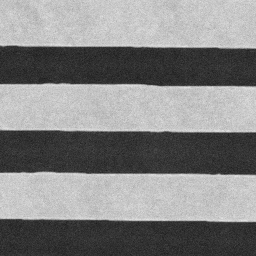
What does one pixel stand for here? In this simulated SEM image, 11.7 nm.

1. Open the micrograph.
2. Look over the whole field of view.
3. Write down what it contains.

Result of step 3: lines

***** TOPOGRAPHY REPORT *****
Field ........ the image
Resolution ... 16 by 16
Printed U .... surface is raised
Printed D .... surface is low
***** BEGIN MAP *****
UUUUUUUUUUUUUUUU
UUUUUUUUUUUUUUUU
UUUUUUUUUUUUUUUU
DDDDDDDDDDDDDDDD
DDDDDDDDDDDDDDDD
UUUUUUUUUUUUUUUU
UUUUUUUUUUUUUUUU
UUUUUUUUUUUUUUUU
DDDDDDDDDDDDDDDD
DDDDDDDDDDDDDDDD
DDDDDDDDDDDDDDDD
UUUUUUUUUUUUUUUU
UUUUUUUUUUUUUUUU
UUUUUUUUUUUUUUUU
DDDDDDDDDDDDDDDD
DDDDDDDDDDDDDDDD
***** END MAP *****